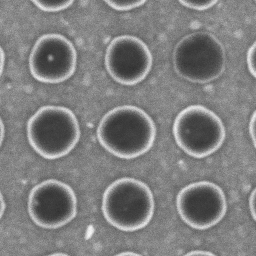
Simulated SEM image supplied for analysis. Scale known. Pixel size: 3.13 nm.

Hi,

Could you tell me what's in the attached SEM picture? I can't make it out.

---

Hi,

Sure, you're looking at a regular array of raised bodies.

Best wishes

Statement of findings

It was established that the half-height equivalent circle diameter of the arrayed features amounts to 0.153 um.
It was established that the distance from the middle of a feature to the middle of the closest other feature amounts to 227 nanometers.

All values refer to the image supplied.